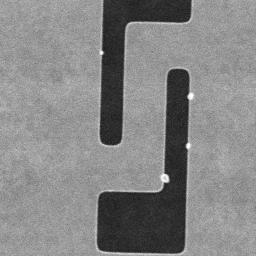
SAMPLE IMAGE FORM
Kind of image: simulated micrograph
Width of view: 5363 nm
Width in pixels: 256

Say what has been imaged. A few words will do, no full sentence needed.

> groups of lines, slits or small figures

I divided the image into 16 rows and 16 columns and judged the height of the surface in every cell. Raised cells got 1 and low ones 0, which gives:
1111110000001111
1111110011111111
1111110011111111
1111110011111111
1111110011101111
1111110011001111
1111110011001111
1111110011001111
1111110011001111
1111111111001111
1111111111001111
1111111111001111
1111110000001111
1111110000001111
1111110000001111
1111110000011111